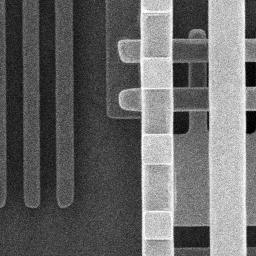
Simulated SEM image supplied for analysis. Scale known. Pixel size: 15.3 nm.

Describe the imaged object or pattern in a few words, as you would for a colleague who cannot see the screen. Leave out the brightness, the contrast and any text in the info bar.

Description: wiring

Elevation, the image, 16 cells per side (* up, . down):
.........**..**.
.........**..**.
.........**..**.
.........**..**.
.........**..**.
.........**..**.
.........**..**.
.........**..**.
.........**..**.
.........**..**.
.........**..**.
.........**..**.
.........**..**.
.........**..**.
.........**..**.
.........**..**.